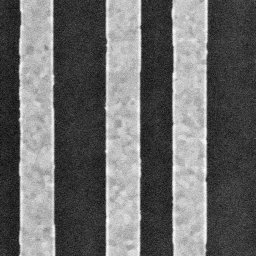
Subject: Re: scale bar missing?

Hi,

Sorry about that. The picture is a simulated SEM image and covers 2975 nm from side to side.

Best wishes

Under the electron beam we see lines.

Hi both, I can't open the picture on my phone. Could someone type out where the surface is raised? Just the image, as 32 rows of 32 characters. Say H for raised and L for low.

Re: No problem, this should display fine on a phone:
LLLHHHHLLLLLLHHHHHLLLLHHHHLLLLLL
LLLHHHHLLLLLLHHHHHLLLLHHHHLLLLLL
LLLHHHHLLLLLLHHHHHLLLLHHHHLLLLLL
LLLHHHHLLLLLLHHHHHLLLLHHHHLLLLLL
LLLHHHHLLLLLLHHHHHLLLLHHHHLLLLLL
LLHHHHHLLLLLLHHHHHLLLLHHHHLLLLLL
LLHHHHHLLLLLLHHHHHLLLLHHHHLLLLLL
LLLHHHHLLLLLLHHHHHLLLLHHHHLLLLLL
LLHHHHHLLLLLLHHHHHLLLLHHHHLLLLLL
LLHHHHHLLLLLLHHHHLLLLLHHHHLLLLLL
LLLHHHHLLLLLLHHHHLLLLLHHHHLLLLLL
LLHHHHHLLLLLLHHHHLLLLLHHHHLLLLLL
LLHHHHHLLLLLLHHHHLLLLLHHHHLLLLLL
LLLHHHHLLLLLLHHHHLLLLLHHHHLLLLLL
LLLHHHHLLLLLLHHHHLLLLLHHHHLLLLLL
LLLHHHHLLLLLLHHHHLLLLLHHHHLLLLLL
LLLHHHHLLLLLLHHHHLLLLLHHHHLLLLLL
LLLHHHHLLLLLLHHHHLLLLLHHHHLLLLLL
LLLHHHHLLLLLLHHHHLLLLLHHHHLLLLLL
LLLHHHHLLLLLLHHHHLLLLLHHHHLLLLLL
LLHHHHHLLLLLLHHHHLLLLLHHHHLLLLLL
LLHHHHHLLLLLLHHHHHLLLLHHHHLLLLLL
LLLHHHHLLLLLLHHHHLLLLLHHHHLLLLLL
LLLHHHHLLLLLLHHHHLLLLLHHHHLLLLLL
LLLHHHHLLLLLLHHHHLLLLLHHHHLLLLLL
LLLHHHHLLLLLLHHHHLLLLLHHHHLLLLLL
LLLHHHHLLLLLLHHHHLLLLLHHHHLLLLLL
LLLHHHHLLLLLLHHHHHLLLLHHHHLLLLLL
LLLHHHHLLLLLLHHHHLLLLLHHHHLLLLLL
LLHHHHHLLLLLLHHHHLLLLLHHHHLLLLLL
LLHHHHHLLLLLLHHHHLLLLLHHHHLLLLLL
LLLHHHHLLLLLLHHHHLLLLLHHHHLLLLLL